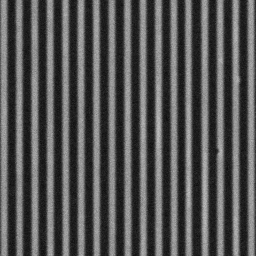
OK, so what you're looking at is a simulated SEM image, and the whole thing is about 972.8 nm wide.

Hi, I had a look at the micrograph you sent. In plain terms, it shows parallel lines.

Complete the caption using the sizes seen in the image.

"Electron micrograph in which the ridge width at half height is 21.4 nanometres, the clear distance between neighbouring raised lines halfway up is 39.5 nm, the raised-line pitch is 58.7 nm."